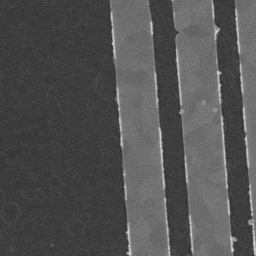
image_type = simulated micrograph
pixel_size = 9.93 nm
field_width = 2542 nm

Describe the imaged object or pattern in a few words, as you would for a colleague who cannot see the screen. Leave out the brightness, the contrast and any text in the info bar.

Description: parallel lines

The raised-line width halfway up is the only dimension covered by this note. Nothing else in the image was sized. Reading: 399 nanometers